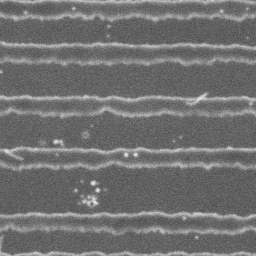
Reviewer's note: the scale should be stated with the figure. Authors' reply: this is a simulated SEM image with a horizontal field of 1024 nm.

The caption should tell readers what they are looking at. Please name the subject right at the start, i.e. lines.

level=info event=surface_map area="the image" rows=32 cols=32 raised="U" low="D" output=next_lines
UUUUUUUUUUUUUUUUUUUUUUUUUUUUUUUU
UUUUUUUUUUUUUUUUUUUUUUUUUUUUUUUU
DDDDDDDDDDDDDDDDDDDDDDDDDDDDDDDD
DDDDDDDDDDDDDDDDDDDDDDDDDDDDDDDD
DDDDDDDDDDDDDDDDDDDDDDDDDDDDDDDD
UDDDDDDDDDDDUDDDDDDDDDDDDDDDDDDD
UUUUUUUUUUUUUUUUUUUUUUUUUUUUUUUU
UUUUUUUUUUUUUUUUUUUUDDUUUUUDDDUU
DDDDDDDDDDDDDDDDDDDDDDDDDDDDDDDD
DDDDDDDDDDDDDDDDDDDDDDDDDDDDDDDD
DDDDDDDDDDDDDDDDDDDDDDDDDDDDDDDD
DDDDDDDDDDDDDDDDDDDDDDDDDDDDDDDD
UUUUUUUUUUUUUUUUUUUUUUUUUUUUUUUU
UUUUUUUUUUUUUUUUUUUUUUUUUUUUUUUU
DDDDDDDDDDDDDDDDDDDDDDDDDDDDDDDD
DDDDDDDDDDDDDDDDDDDDDDDDDDDDDDDD
DDDDDDDDDDDDDDDDDDDDDDDDDDDDDDDD
DDDDDDDDDDDDDDDDDDDDDDDDDDDDDDDD
DDDDDDDDDDDDDDDDDDDDDDDDDDDDDDDD
UUUUUUUUUUUUUUUUUUUUUUUUUUUUUUUU
UUUUUUUUUUUUUDDUUUUUUUUUUUUUUUUU
DDDDDDDDDDDDDDDDDDDDDDDDDDDDDDDD
DDDDDDDDDDDDDDDDDDDDDDDDDDDDDDDD
DDDDDDDDDDDDDDDDDDDDDDDDDDDDDDDD
DDDDDDDDDDDDDDDDDDDDDDDDDDDDDDDD
DDDDDDDDDDDDDDDDDDDDDDDDDDDDDDDD
DDDDDDDDDDDDDDDDDDDDDDDDDDDDDDDD
UUUUUUUUUUUUUUUUUUUUUUUUUUUUUUUU
UDUUDUUDUUUUUUUUUUUUUUUUUUUUUUUU
DDDDDDDDDDDDDDDDDDDDDDDDDDDDDDDD
DDDDDDDDDDDDDDDDDDDDDDDDDDDDDDDD
DDDDDDDDDDDDDDDDDDDDDDDDDDDDDDDD